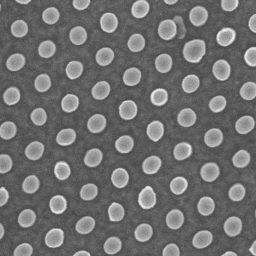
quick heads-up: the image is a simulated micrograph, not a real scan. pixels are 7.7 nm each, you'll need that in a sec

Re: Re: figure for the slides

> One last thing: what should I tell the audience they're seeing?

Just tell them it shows a regular array of raised bodies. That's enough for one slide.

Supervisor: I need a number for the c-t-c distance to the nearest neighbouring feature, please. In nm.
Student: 257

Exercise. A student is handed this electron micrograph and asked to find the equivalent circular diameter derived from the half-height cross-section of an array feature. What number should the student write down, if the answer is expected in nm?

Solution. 137